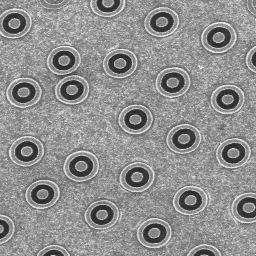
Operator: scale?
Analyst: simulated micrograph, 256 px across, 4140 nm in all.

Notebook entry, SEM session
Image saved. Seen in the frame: a regular array of ring-shaped raised bodies with a dot in the middle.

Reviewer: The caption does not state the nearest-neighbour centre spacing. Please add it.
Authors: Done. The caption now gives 845 nm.